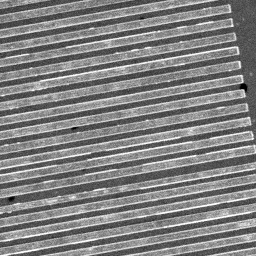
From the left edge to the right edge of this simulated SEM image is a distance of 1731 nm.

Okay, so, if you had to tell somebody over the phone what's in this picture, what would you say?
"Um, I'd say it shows parallel lines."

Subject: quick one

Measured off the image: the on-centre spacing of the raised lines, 96.8 nm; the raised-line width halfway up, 0.0508 µm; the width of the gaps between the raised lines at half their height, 45.8 nanometres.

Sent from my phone